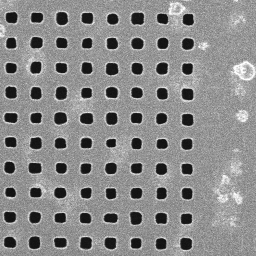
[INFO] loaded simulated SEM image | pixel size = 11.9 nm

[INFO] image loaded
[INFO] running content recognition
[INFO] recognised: a regular array of holes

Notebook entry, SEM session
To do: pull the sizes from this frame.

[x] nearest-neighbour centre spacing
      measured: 294 nm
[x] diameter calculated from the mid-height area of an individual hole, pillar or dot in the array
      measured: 142 nm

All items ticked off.